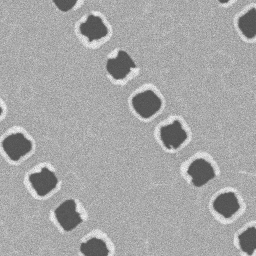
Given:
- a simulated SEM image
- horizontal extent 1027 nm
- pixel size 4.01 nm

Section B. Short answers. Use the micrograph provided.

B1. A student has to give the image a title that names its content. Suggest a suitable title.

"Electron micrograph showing a regular array of holes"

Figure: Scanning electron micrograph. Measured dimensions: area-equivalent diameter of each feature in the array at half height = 103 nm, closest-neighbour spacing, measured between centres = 41.7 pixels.